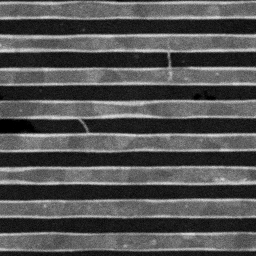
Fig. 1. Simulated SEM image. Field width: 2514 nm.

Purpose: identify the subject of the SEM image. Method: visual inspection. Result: wiring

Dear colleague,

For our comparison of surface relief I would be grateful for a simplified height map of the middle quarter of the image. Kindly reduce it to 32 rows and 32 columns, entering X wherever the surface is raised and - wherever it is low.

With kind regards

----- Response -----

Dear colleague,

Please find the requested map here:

--------------------------------
XXXXXXXXXXXXXXXXXXXXXXXXXXXXXXXX
XXXXXXXXXXXXXXXXXXXXXXXXXXXXXXXX
XXXXXXXXXXXXXXXXXXXXXXXXXXXXXXXX
XXXXXXXXXXXXXXXXXXXXXXXXXXXXXXXX
--------------------------------
--------------------------------
--------------------------------
--------------------------------
XXXXXXXX--------------XXXXXXXXXX
XXXXXXXXXXXXXXXXXXXXXXXXXXXXXXXX
XXXXXXXXXXXXXXXXXXXXXXXXXXXXXXXX
XXXXXXXXXXXXXXXXXXXXXXXXXXXXXXXX
---XX---------------------------
--------------------------------
--------------------------------
--------------------------------
--------------------------------
XXXXXXXXXXXXXXXXXXXXXXXXXXXXXXXX
XXXXXXXXXXXXXXXXXXXXXXXXXXXXXXXX
XXXXXXXXXXXXXXXXXXXXXXXXXXXXXXXX
XXXXXXXXXXXXXXXXXX-----XXXXXXXXX
--------------------------------
--------------------------------
--------------------------------
--------------------------------
XXXXXXXXXXXXXXXXXXXXXXXXXXXXXXXX
XXXXXXXXXXXXXXXXXXXXXXXXXXXXXXXX
XXXXXXXXXXXXXXXXXXXXXXXXXXXXXXXX
XXXXXXXXXXXXXXXXXXXXXXXXXXXXXXXX
--------------------------------
--------------------------------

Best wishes